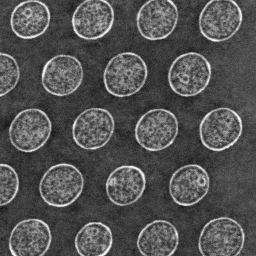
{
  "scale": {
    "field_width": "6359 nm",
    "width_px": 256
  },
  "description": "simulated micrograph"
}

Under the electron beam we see a regular array of raised bodies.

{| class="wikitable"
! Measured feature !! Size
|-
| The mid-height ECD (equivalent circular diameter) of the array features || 1.02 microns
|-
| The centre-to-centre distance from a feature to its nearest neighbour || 1560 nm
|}